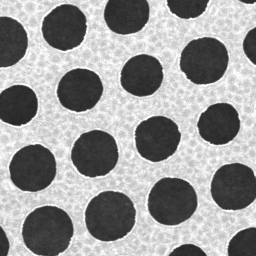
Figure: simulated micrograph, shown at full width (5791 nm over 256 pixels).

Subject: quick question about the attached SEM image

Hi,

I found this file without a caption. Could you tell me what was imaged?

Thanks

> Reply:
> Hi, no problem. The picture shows a regular array of holes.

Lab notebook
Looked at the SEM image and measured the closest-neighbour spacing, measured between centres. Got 1440 nm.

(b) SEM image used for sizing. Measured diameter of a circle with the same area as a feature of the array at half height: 1060 nm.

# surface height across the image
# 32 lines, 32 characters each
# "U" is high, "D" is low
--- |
UUUUUUUUUUUUUDDDDDDUUDDDDDUUUUUU
UUUUUUDDDDUUUDDDDDDUUDDDDUUUUUUU
DDUUUDDDDDDUUDDDDDDUUUUUUUUUUUUU
DDDUUDDDDDDUUUDDDDUUUUUUUUUUUUUU
DDDUUDDDDDDUUUUUUUUUUUUUUUUUUUUD
DDDDUUDDDDUUUUUUUUUUUUUDDDDDUUDD
DDDUUUUUUUUUUUUUUUUUUUUDDDDDUUUD
DDDUUUUUUUUUUUUUDDDDUUDDDDDDDUUD
UUUUUUUUUUUUUUUDDDDDUUUDDDDDUUUU
UUUUUUUUDDDDUUUDDDDDUUUDDDDDUUUU
UUUUUUUDDDDDDUUDDDDDUUUUUDUUUUUU
DDDDUUUDDDDDDUUUDDDUUUUUUUUUUUUU
DDDDDUUDDDDDUUUUUUUUUUUUUUUUUUUU
DDDDDUUUDDDDUUUUUUUUUUUUUUDDDUUU
DDDDUUUUUUUUUUUUUUUUUUUUUDDDDDUU
UDDUUUUUUUUUUUUUUDDDDDUUUDDDDDUU
UUUUUUUUUUUDDUUUUDDDDDUUUDDDDDUU
UUUUUUUUUUDDDDUUUDDDDDDUUUDDDUUU
UUUDDDUUUDDDDDDUUDDDDDUUUUUUUUUU
UUDDDDDUUDDDDDDUUUDDDUUUUUUUUUUU
UDDDDDDUUDDDDDDUUUUUUUUUUUUUDDUU
UDDDDDDUUUDDDDUUUUUUUUUUUUUDDDDD
UDDDDDDUUUUUUUUUUUUUDDDUUUDDDDDD
UUDDDDUUUUUUUUUUUUUDDDDDUUDDDDDD
UUUUUUUUUUUUDDDDUUUDDDDDDUDDDDDD
UUUUUUUUUUUDDDDDDUDDDDDDDUUDDDDU
UUUUDDDDUUUDDDDDDUUDDDDDUUUUUUUU
UUUDDDDDDUUDDDDDDUUDDDDUUUUUUUUU
UUUDDDDDDUUDDDDDDUUUUUUUUUUUUUUD
DUUDDDDDDUUUDDDDUUUUUUUUUUUUUDDD
DUUDDDDDDUUUUUUUUUUUUUUUUUUUUDDD
DUUUDDDDUUUUUUUUUUUUUDDDDDUUDDDD